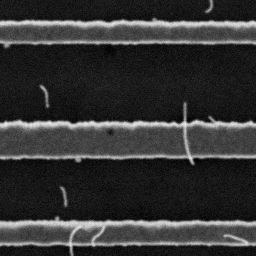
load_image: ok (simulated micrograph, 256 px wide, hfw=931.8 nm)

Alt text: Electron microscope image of lines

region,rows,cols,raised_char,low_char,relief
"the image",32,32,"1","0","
00000000000000000000000000000000
00000000000000000000000000000000
00000000000000000000000000000000
11111111111111111111111111111111
11111111111111111111111111111111
00000000000000000000000000000000
00000000000000000000000000000000
00000000000000000000000000000000
00000000000000000000000000000000
00000000000000000000000000000000
00000000000000000000000000000000
00000000000000000000000000000000
00000000000000000000000000000000
00000000000000000000000000000000
00000000000000000000000000000000
11111111111111111111111111111111
11111111111111111111111111111111
11111111111111111111111111111111
11111111111111111111111111111111
11111111111111111111111111111111
00000000000000000000000000000000
00000000000000000000000000000000
00000000000000000000000000000000
00000000000000000000000000000000
00000000000000000000000000000000
00000000000000000000000000000000
00000000000000000000000000000000
00000000000000000000000000000000
11111111111111111111111111111111
11111111111111111111111111111111
11111111111111111111111111111111
00000000000000000000000000000000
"